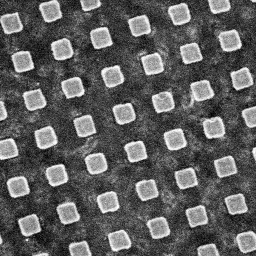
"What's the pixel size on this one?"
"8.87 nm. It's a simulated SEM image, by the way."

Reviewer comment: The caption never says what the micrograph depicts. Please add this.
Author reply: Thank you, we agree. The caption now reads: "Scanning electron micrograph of a regular array of raised bodies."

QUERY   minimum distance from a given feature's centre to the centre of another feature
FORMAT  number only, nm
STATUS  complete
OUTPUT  351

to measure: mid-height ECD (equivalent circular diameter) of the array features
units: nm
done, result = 175